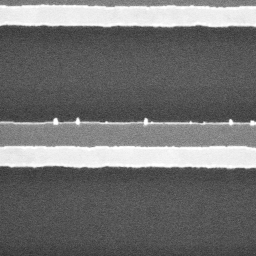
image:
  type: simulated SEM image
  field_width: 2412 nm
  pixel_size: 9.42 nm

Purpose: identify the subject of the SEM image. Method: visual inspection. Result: lines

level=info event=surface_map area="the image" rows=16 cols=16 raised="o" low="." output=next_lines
oooooooooooooooo
oooooooooooooooo
................
................
................
................
................
................
oooooooooooooooo
oooooooooooooooo
................
................
................
................
................
................